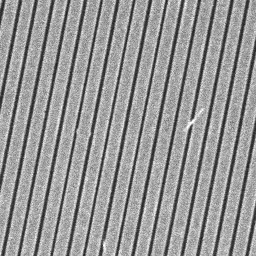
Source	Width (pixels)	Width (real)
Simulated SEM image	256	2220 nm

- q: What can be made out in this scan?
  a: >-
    parallel lines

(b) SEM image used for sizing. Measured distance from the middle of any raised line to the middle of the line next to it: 0.139 microns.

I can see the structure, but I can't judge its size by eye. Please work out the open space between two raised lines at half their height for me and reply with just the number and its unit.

0.033 microns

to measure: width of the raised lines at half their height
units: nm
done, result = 108